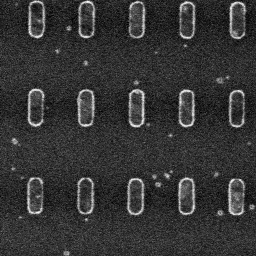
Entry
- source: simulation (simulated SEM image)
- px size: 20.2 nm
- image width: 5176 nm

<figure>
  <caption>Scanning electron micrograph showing a regular array of raised bodies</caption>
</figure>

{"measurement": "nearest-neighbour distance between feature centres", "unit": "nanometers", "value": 1010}